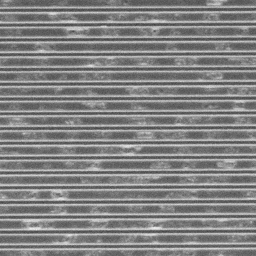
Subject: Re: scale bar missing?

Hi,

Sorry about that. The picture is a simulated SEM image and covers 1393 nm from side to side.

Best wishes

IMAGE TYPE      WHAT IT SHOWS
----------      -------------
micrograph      parallel lines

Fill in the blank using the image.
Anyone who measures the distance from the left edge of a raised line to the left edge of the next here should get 0.0804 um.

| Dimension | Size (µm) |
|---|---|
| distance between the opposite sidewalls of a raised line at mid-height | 0.0599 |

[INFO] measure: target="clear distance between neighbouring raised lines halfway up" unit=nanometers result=22.4